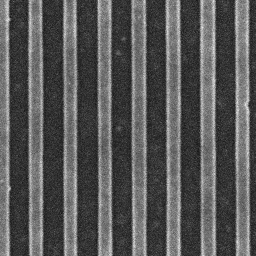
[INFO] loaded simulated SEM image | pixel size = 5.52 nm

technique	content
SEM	parallel lines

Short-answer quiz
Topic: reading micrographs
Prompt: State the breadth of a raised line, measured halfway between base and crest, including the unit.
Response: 63.5 nanometres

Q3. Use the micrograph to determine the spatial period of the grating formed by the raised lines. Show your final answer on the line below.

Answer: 190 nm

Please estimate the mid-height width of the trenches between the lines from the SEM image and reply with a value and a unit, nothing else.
128 nm